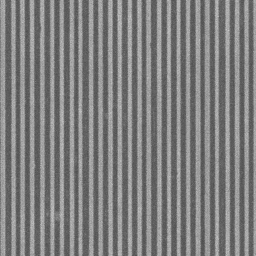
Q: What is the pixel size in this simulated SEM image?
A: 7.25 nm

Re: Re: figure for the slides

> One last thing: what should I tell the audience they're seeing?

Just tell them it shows parallel lines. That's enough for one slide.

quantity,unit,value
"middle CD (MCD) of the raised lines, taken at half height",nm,27.2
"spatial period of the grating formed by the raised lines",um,0.0705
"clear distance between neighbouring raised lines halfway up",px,5.75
